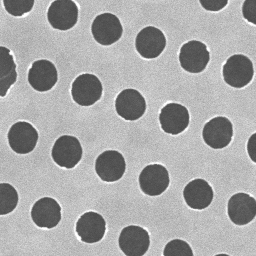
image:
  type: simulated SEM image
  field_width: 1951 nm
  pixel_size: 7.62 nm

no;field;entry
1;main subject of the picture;a regular array of holes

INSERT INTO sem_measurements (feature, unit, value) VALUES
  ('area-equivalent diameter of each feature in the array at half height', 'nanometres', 238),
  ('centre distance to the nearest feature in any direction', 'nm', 350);